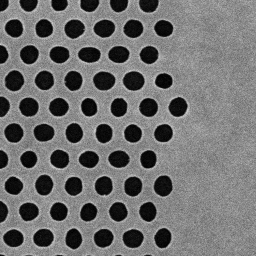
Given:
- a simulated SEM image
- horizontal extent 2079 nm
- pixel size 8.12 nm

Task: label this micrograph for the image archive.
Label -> a regular array of holes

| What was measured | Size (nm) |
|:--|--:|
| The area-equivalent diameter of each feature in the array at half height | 151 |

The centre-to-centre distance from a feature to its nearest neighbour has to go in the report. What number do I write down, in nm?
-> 239